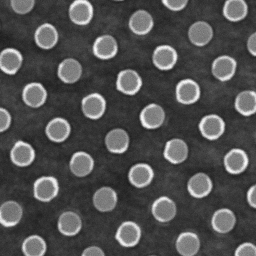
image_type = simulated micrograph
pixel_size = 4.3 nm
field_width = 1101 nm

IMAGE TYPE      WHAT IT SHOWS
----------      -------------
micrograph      a regular array of raised bodies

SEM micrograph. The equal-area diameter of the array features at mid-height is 104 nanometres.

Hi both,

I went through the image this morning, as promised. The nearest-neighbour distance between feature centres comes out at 180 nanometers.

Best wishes